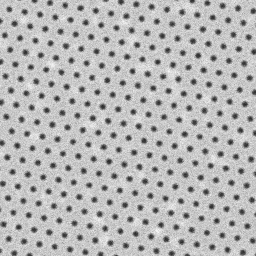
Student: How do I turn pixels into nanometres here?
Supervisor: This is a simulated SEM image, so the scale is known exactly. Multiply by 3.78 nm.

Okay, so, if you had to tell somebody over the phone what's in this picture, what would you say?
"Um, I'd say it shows a regular array of holes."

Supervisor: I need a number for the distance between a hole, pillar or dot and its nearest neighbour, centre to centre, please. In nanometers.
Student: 57.5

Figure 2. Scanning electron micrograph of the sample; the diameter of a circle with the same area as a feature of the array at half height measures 22.6 nanometers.